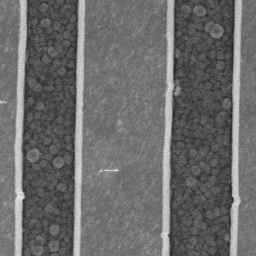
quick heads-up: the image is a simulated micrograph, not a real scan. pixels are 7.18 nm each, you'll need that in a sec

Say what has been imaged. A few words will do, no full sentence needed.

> one or a few lines or trenches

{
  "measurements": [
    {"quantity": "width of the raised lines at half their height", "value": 634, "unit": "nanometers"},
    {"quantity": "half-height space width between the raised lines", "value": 457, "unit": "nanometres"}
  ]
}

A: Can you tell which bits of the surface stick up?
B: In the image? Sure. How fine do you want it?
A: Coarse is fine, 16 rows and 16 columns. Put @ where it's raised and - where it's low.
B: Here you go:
@----@@@@@@----@
@----@@@@@@----@
@----@@@@@@----@
@----@@@@@@----@
@----@@@@@@----@
@----@@@@@@----@
@----@@@@@@----@
@----@@@@@@----@
@----@@@@@-----@
@----@@@@@-----@
@----@@@@@-----@
@----@@@@@-----@
@----@@@@@-----@
@----@@@@@-----@
@----@@@@@-----@
@----@@@@@-----@